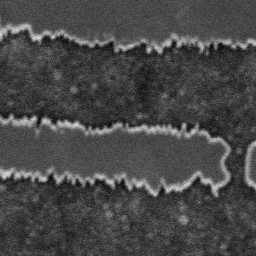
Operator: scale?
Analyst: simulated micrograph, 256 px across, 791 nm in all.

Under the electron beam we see one or a few lines or trenches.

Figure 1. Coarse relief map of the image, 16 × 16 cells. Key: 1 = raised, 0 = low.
1111111111111111
1111111111111111
0000011111111111
0000000000000000
0000000000000000
0000000000000000
0000000000000000
1000000000000000
1111111111111000
1111111111111100
1111111111111101
0000000011110100
0000000000000000
0000000000000000
0000000000000000
0000000000000000